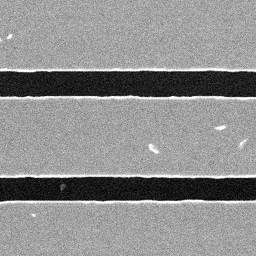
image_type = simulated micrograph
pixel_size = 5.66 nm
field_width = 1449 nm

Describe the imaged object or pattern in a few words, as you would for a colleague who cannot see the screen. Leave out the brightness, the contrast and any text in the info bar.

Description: lines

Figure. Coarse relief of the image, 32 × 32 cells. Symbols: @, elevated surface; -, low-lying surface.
@@@@@@@@@@@@@@@@@@@@@@@@@@@@@@@@
@@@@@@@@@@@@@@@@@@@@@@@@@@@@@@@@
@@@@@@@@@@@@@@@@@@@@@@@@@@@@@@@@
@@@@@@@@@@@@@@@@@@@@@@@@@@@@@@@@
@@@@@@@@@@@@@@@@@@@@@@@@@@@@@@@@
@@@@@@@@@@@@@@@@@@@@@@@@@@@@@@@@
@@@@@@@@@@@@@@@@@@@@@@@@@@@@@@@@
@@@@@@@@@@@@@@@@@@@@@@@@@@@@@@@@
@@@@@@@@@@@@@@@@@@@@@@@@@@@@@@@@
--------------------------------
--------------------------------
--------------------------------
@@@@@@@@@@@@@@@@@@@@@@@@@@@@@@@@
@@@@@@@@@@@@@@@@@@@@@@@@@@@@@@@@
@@@@@@@@@@@@@@@@@@@@@@@@@@@@@@@@
@@@@@@@@@@@@@@@@@@@@@@@@@@@@@@@@
@@@@@@@@@@@@@@@@@@@@@@@@@@@@@@@@
@@@@@@@@@@@@@@@@@@@@@@@@@@@@@@@@
@@@@@@@@@@@@@@@@@@@@@@@@@@@@@@@@
@@@@@@@@@@@@@@@@@@@@@@@@@@@@@@@@
@@@@@@@@@@@@@@@@@@@@@@@@@@@@@@@@
@@@@@@@@@@@@@@@@@@@@@@@@@@@@@@@@
--------------------------------
--------------------------------
--------------------------------
@@@@@@@@@@@@@@@@@@@@@@@@@@@@@@@@
@@@@@@@@@@@@@@@@@@@@@@@@@@@@@@@@
@@@@@@@@@@@@@@@@@@@@@@@@@@@@@@@@
@@@@@@@@@@@@@@@@@@@@@@@@@@@@@@@@
@@@@@@@@@@@@@@@@@@@@@@@@@@@@@@@@
@@@@@@@@@@@@@@@@@@@@@@@@@@@@@@@@
@@@@@@@@@@@@@@@@@@@@@@@@@@@@@@@@